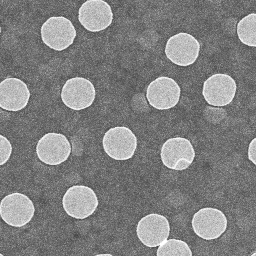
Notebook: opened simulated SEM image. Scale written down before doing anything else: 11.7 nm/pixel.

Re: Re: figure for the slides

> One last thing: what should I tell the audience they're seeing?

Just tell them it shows a regular array of raised bodies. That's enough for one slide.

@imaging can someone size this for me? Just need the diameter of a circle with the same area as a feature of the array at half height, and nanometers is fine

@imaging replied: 383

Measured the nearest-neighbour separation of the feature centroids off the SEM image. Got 0.684 microns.